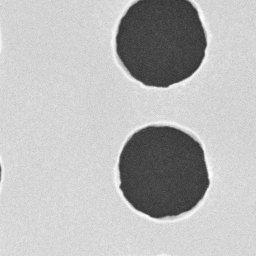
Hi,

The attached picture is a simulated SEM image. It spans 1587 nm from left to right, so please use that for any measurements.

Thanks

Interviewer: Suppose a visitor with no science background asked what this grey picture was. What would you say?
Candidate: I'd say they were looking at holes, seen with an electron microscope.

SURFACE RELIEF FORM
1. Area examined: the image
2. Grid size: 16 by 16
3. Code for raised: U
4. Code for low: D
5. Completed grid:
UUUUUUUUDDDDUUUU
UUUUUUUDDDDDDUUU
UUUUUUUDDDDDDUUU
UUUUUUUDDDDDDUUU
UUUUUUUUDDDDUUUU
UUUUUUUUUUUUUUUU
UUUUUUUUUUUUUUUU
UUUUUUUUUUUUUUUU
UUUUUUUUDDDDUUUU
UUUUUUUUDDDDDUUU
UUUUUUUDDDDDDUUU
UUUUUUUDDDDDDUUU
UUUUUUUUDDDDDUUU
UUUUUUUUUDDUUUUU
UUUUUUUUUUUUUUUU
UUUUUUUUUUUUUUUU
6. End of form